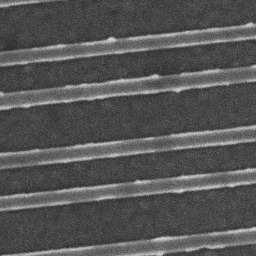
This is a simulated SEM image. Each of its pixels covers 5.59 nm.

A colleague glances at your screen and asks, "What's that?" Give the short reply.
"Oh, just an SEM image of parallel lines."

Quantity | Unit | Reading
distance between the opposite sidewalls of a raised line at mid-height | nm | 86.2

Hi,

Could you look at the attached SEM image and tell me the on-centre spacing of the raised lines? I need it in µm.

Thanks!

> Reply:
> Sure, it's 0.275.